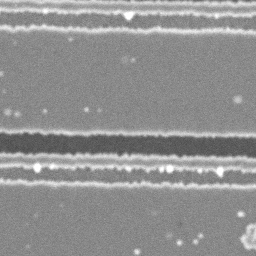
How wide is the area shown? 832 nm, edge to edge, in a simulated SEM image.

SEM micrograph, lines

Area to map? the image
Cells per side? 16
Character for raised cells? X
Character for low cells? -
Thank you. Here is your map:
XXXXXXXXXXXXXXXX
XXXXXXXXXXXXXXXX
XXXXXXXXXXXXXXXX
XXXXXXXXXXXXXXXX
XXXXXXXXXXXXXXXX
XXXXXXXXXXXXXXXX
XXXXXXXXXXXXXXXX
XXXXXXXXXXXXXXXX
----------------
----------------
XXXXXXXXXXXXXXXX
XXXXXXXXXXXXXXXX
XXXXXXXXXXXXXXXX
XXXXXXXXXXXXXXXX
XXXXXXXXXXXXXXXX
XXXXXXXXXXXXXXXX